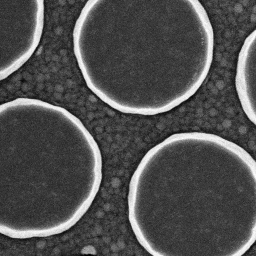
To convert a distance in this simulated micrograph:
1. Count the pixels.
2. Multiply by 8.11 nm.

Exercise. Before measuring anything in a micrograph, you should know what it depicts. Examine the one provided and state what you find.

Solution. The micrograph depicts raised bodies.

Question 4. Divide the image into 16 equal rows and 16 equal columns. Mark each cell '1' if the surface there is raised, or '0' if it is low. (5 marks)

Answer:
1110001111110000
1100011111111000
1100011111111000
1100011111111001
0000011111111001
0000001111110001
1110000111100001
1111100000000000
1111110000011000
1111110001111110
1111110001111111
1111110011111111
1111110011111111
1111100011111111
0110000001111111
0000000001111110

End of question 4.